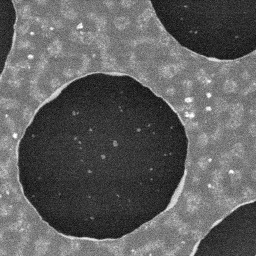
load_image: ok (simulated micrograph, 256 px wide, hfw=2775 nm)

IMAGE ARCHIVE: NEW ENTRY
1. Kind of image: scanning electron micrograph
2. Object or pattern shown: holes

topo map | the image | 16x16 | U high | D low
DUUUUUUUUUDDDDDD
DUUUUUUUUUDDDDDD
DUUUUUUUUUUDDDDD
DUUUUUUUUUUUUDDU
UUUUUUUUUUUUUUUU
UUUUDDDDDUUUUUUU
UUUDDDDDDDUUUUUU
UUDDDDDDDDDUUUUU
UDDDDDDDDDDDUUUU
UDDDDDDDDDDDUUUU
UDDDDDDDDDDDUUUU
UDDDDDDDDDDUUUUU
UUDDDDDDDDDUUUUU
UUUDDDDDDDUUUUDD
UUUUDDDDUUUUUDDD
UUUUUUUUUUUUDDDD